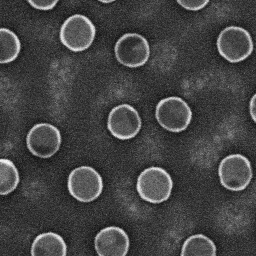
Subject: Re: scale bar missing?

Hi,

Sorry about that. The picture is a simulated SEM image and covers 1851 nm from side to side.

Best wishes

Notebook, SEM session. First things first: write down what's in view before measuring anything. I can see a regular array of raised bodies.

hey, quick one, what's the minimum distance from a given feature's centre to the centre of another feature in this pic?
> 0.433 um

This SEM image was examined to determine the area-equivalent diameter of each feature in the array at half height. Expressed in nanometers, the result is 242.